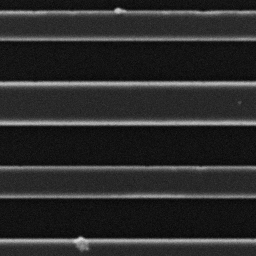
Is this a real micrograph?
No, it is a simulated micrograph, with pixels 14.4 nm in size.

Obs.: lines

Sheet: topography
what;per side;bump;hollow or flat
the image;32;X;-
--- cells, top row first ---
--------------------------------
------------X-XXX---------------
XXXXXXXXXXXXXXXXXXXXXXXXXXXXXXXX
XXXXXXXXXXXXXXXXXXXXXXXXXXXXXXXX
XXXXXXXXXXXXXXXXXXXXXXXXXXXXXXXX
--------------------------------
--------------------------------
--------------------------------
--------------------------------
--------------------------------
XXXXXXXXXXXXXXXXXXXXXXXXXXXXXXXX
XXXXXXXXXXXXXXXXXXXXXXXXXXXXXXXX
XXXXXXXXXXXXXXXXXXXXXXXXXXXXXXXX
XXXXXXXXXXXXXXXXXXXXXXXXXXXXXXXX
XXXXXXXXXXXXXXXXXXXXXXXXXXXXXXXX
XXXXXXXXXXXXXXXX-XXXX-----------
--------------------------------
--------------------------------
--------------------------------
--------------------------------
--------------------------------
XXXXXXXXXXXXXXXXXXXXXXXXXXXXXXXX
XXXXXXXXXXXXXXXXXXXXXXXXXXXXXXXX
XXXXXXXXXXXXXXXXXXXXXXXXXXXXXXXX
XXXXXXXXXXXXXXXXXXXXXXXXXXXXXXXX
--------------------------------
--------------------------------
--------------------------------
--------------------------------
--------------------------------
XXXXXXXXXXXXXXXXXXXXXXXXXXXXXXXX
XXXXXXXXXXXXXXXXXXXXXXXXXXXXXXXX